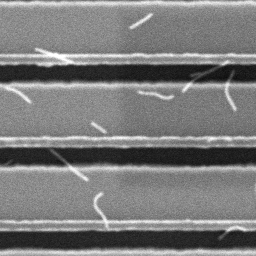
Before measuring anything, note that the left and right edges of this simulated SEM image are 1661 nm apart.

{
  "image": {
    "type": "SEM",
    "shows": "lines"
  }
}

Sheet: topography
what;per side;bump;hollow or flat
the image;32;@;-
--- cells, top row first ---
@@@@@@@@@@@@@@@@@@@@@@@@@@@@@@@@
@@@@@@@@@@@@@@@@@@@@@@@@@@@@@@@@
@@@@@@@@@@@@@@@@@@@@@@@@@@@@@@@@
@@@@@@@@@@@@@@@@@@@@@@@@@@@@@@@@
@@@@@@@@@@@@@@@@@@@@@@@@@@@@@@@@
@@@@@@@@@@@@@@@@@@@@@@@@@@@@@@@@
@@@@@@@@@@@@@@@@@@@@@@@@@@@@@@@@
@@@@@@@@@@@@@@@@@@@@@@@@@@@@@@@@
--------------------------------
--------------------------------
-----------------------@----@---
@@@@@@@@@@@@@@@@@@@@@@@@@@@@@@@@
@@@@@@@@@@@@@@@@@@@@@@@@@@@@@@@@
@@@@@@@@@@@@@@@@@@@@@@@@@@@@@@@@
@@@@@@@@@@@@@@@@@@@@@@@@@@@@@@@@
@@@@@@@@@@@@@@@@@@@@@@@@@@@@@@@@
@@@@@@@@@@@@@@@@@@@@@@@@@@@@@@@@
@@@@@@@@@@@@@@@@@@@@@@@@@@@@@@@@
--------------------------------
--------------------------------
--------------------------------
@@@@@@@@@@@@@@@@@@@@@@@@@@@@@@@@
@@@@@@@@@@@@@@@@@@@@@@@@@@@@@@@@
@@@@@@@@@@@@@@@@@@@@@@@@@@@@@@@@
@@@@@@@@@@@@@@@@@@@@@@@@@@@@@@@@
@@@@@@@@@@@@@@@@@@@@@@@@@@@@@@@@
@@@@@@@@@@@@@@@@@@@@@@@@@@@@@@@@
@@@@@@@@@@@@@@@@@@@@@@@@@@@@@@@@
@@@@@@@@@@@@@@@@@@@@@@@@@@@@@@@@
--------------------------------
--------------------------------
@@@@@@@@@@@@@@@@@@@@@@-@@@@@@@@@